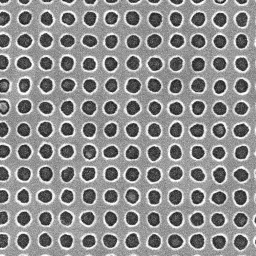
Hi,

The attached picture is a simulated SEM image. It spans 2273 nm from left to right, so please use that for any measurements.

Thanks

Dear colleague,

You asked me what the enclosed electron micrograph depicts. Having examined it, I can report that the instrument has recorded a regular array of holes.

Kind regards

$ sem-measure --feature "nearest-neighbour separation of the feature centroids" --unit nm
189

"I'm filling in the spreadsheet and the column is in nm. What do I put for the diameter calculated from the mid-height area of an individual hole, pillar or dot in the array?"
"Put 130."